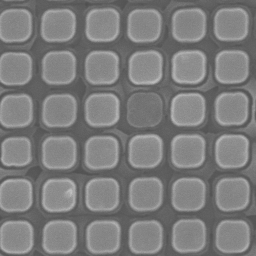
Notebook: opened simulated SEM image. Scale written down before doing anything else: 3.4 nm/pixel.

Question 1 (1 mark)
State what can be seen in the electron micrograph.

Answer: a regular array of raised bodies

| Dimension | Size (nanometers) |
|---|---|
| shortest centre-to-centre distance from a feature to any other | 143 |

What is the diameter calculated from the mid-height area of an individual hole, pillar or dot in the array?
35 pixels